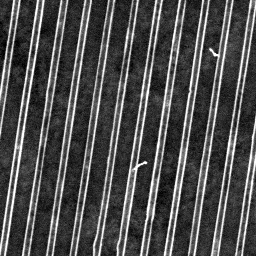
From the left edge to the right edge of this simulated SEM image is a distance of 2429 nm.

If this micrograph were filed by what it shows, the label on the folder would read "parallel lines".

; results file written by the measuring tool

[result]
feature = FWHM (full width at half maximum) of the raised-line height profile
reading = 55.2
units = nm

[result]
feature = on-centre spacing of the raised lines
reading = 222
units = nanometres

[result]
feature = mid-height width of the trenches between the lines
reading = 164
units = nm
